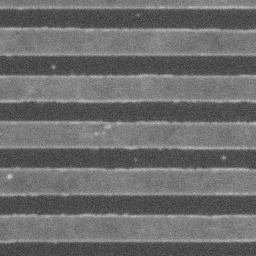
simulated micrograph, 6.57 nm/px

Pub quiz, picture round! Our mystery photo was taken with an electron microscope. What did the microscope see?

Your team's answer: lines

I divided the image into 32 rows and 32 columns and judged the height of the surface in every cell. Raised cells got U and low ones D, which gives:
UUUUUUUUUUUUUUUUUUUUUUUUUUUUUUUU
DDDDDDDDDDDDDDDDDDDDDDDDDDDDDDDD
DDDDDDDDDDDDDDDDDDDDDDDDDDDDDDDD
DDDDDUDDDDDDDDDDDDDDDDDDDDDDDDDD
UUUUUUUUUUUUUUUUUUUUUUUUUUUUUUUU
UUUUUUUUUUUUUUUUUUUUUUUUUUUUUUUU
UUUUUUUUUUUUUUUUUUUUUUUUUUUUUUUU
DDDDDDDDDDDDDDDDDDDDDDDDDDDDDDDD
DDDDDDDDDDDDDDDDDDDDDDDDDDDDDDDD
DDDDDDUDUUUDDUDDDUUUUUDDDDDDUUUU
UUUUUUUUUUUUUUUUUUUUUUUUUUUUUUUU
UUUUUUUUUUUUUUUUUUUUUUUUUUUUUUUU
UUUUUUUUUUUUUUUUUUUUUUUUUUUUUUUU
DDDDDDDDDDDDDDDDDDDDDDDDDDDDDDDD
DDDDDDDDDDDDDDDDDDDDDDDDDDDDDDDD
UUUUUUUUUUUUUUUUUUUUUUUUUUUUUUUU
UUUUUUUUUUUUUUUUUUUUUUUUUUUUUUUU
UUUUUUUUUUUUUUUUUUUUUUUUUUUUUUUU
DDDDDDDDDDDUUDDUUUDDUUUUUUUUUUUU
DDDDDDDDDDDDDDDDDDDDDDDDDDDDDDDD
DDDDDDDDDDDDDDDDDDDDDDDDDDDDDDDD
UUUUUUUUUUUUUUUUUUUUUUUUUUUUUUUU
UUUUUUUUUUUUUUUUUUUUUUUUUUUUUUUU
UUUUUUUUUUUUUUUUUUUUUUUUUUUUUUUU
DDDDDDDDDDDDDDDDDDDDDDDDDDDDDDDD
DDDDDDDDDDDDDDDDDDDDDDDDDDDDDDDD
DDDDDDDDDDDDDDDDDDDDDDDDDDDDDDDD
UUUUUUUUUUUUUUUUUUUUUUUUUUUUUUUU
UUUUUUUUUUUUUUUUUUUUUUUUUUUUUUUU
UUUUUUUUUUUUUUUUUUUUUUUUUUUUUUUU
DDDDDDDDDDDDDDDDDDDDDDDDDDDDDDDD
DDDDDDDDDDDDDDDDDDDDDDDDDDDDDDDD